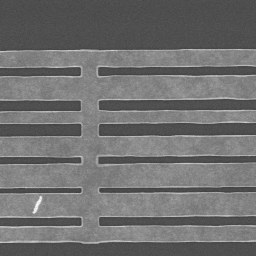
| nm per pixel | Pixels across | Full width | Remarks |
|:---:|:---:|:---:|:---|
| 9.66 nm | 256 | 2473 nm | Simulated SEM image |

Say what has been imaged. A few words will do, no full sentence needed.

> groups of lines, slits or small figures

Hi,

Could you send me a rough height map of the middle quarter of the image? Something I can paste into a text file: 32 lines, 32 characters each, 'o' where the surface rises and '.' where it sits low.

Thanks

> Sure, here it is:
oooooooooooooooooooooooooooooooo
....oooo........................
....oooo........................
oooooooooooooooooooooooooooooooo
oooooooooooooooooooooooooooooooo
oooooooooooooooooooooooooooooooo
oooooooooooooooooooooooooooooooo
oooooooooooooooooooooooooooooooo
oooooooooooooooooooooooooooooooo
....ooooo.......................
....ooooo.......................
....ooooo.......................
oooooooooooooooooooooooooooooooo
oooooooooooooooooooooooooooooooo
oooooooooooooooooooooooooooooooo
....ooooo.......................
....ooooo.......................
....ooooo.......................
oooooooooooooooooooooooooooooooo
oooooooooooooooooooooooooooooooo
oooooooooooooooooooooooooooooooo
oooooooooooooooooooooooooooooooo
oooooooooooooooooooooooooooooooo
....oooo........................
.....ooo........................
oooooooooooooooooooooooooooooooo
oooooooooooooooooooooooooooooooo
oooooooooooooooooooooooooooooooo
oooooooooooooooooooooooooooooooo
oooooooooooooooooooooooooooooooo
oooooooooooooooooooooooooooooooo
.....oooo.......................